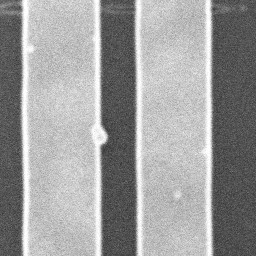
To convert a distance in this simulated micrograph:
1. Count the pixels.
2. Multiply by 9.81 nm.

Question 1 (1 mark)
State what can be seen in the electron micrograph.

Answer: wiring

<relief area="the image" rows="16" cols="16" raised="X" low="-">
--XXXX---XXXX---
--XXXX---XXXX---
--XXXX---XXXX---
--XXXX---XXXX---
--XXXX---XXXX---
--XXXX---XXXX---
--XXXX---XXXX---
--XXXX---XXXX---
--XXXXX--XXXX---
--XXXX---XXXX---
--XXXX---XXXX---
--XXXX---XXXX---
--XXXX---XXXX---
--XXXX---XXXX---
--XXXX---XXXX---
--XXXX---XXXX---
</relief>